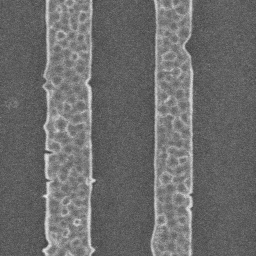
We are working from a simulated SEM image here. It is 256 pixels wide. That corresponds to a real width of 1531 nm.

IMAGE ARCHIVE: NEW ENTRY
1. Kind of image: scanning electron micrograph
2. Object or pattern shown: one or a few lines or trenches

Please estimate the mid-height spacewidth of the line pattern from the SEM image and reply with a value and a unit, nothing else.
387 nanometers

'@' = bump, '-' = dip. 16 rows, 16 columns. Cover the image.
---@@@----@@----
---@@@----@@----
---@@@----@@----
---@@@----@@----
---@@@----@@----
---@@@----@@----
---@@@----@@----
---@@@----@@----
---@@@----@@----
---@@@----@@----
---@@@----@@----
---@@@----@@----
---@@@----@@----
---@@@----@@----
---@@@----@@----
---@@@----@@----